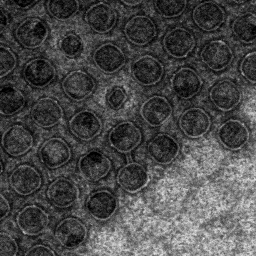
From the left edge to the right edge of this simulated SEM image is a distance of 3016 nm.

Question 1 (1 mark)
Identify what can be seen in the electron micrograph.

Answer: a regular array of raised bodies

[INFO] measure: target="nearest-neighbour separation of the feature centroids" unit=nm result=474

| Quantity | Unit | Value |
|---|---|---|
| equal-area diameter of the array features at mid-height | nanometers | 343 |